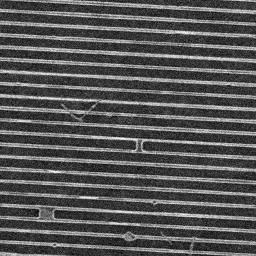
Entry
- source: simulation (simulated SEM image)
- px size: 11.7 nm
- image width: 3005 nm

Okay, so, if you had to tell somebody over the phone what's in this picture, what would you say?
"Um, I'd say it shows parallel lines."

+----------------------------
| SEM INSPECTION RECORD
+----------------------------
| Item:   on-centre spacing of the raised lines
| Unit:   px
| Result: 12.1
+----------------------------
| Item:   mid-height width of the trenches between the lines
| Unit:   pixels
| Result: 9.98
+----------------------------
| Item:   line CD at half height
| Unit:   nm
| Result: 29.3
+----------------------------